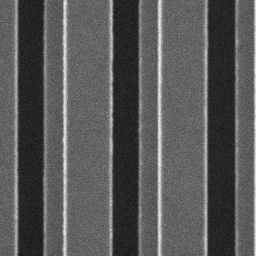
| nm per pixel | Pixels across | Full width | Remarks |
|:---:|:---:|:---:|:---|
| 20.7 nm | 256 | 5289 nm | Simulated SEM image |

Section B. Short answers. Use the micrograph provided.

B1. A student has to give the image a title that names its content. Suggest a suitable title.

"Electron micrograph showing lines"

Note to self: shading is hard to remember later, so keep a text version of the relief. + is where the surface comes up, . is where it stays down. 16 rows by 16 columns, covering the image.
+..++++..++++..+
+..++++..++++..+
+..++++..++++..+
+..++++..++++..+
+..++++..++++..+
+..++++..++++..+
+..++++..++++..+
+..++++..++++..+
+..++++..++++..+
+..++++..++++..+
+..++++..++++..+
+..++++..++++..+
+..++++..++++..+
+..++++..++++..+
+..++++..++++..+
+..++++..++++..+